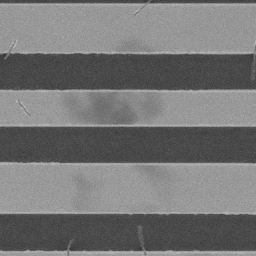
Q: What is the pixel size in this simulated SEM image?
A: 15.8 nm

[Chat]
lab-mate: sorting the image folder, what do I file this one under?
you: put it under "lines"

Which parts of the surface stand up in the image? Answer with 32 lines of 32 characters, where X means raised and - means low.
------------------X-------------
XXXXXXXXXXXXXXXXXXXXXXXXXXXXXXXX
XXXXXXXXXXXXXXXXXXXXXXXXXXXXXXXX
XXXXXXXXXXXXXXXXXXXXXXXXXXXXXXXX
XXXXXXXXXXXXXXXXXXXXXXXXXXXXXXXX
XXXXXXXXXXXXXXXXXXXXXXXXXXXXXXXX
XXXXXXXXXXXXXXXXXXXXXXXXXXXXXXXX
--------------------------------
--------------------------------
--------------------------------
--------------------------------
XXXXXXXXXXXXXXXXXXXXXXXXXXXXXXXX
XXXXXXXXXXXXXXXXXXXXXXXXXXXXXXXX
XXXXXXXXXXXXXXXXXXXXXXXXXXXXXXXX
XXXXXXXXXXXXXXXXXXXXXXXXXXXXXXXX
XXXXXXXXXXXXXXXXXXXXXXXXXXXXXXXX
--------------------------------
--------------------------------
--------------------------------
--------------------------------
XXXXXXXXXXXXXXXXXXXXXXXXXXXXXXXX
XXXXXXXXXXXXXXXXXXXXXXXXXXXXXXXX
XXXXXXXXXXXXXXXXXXXXXXXXXXXXXXXX
XXXXXXXXXXXXXXXXXXXXXXXXXXXXXXXX
XXXXXXXXXXXXXXXXXXXXXXXXXXXXXXXX
XXXXXXXXXXXXXXXXXXXXXXXXXXXXXXXX
XXXXXXXXXXXXXXXXXXXXXXXXXXXXXXXX
--------------------------------
--------------------------------
--------------------------------
--------------------------------
XXXXXXXXXXXXXXXXXXXXXXXXXXXXXXXX